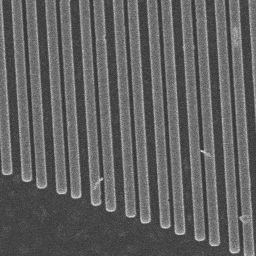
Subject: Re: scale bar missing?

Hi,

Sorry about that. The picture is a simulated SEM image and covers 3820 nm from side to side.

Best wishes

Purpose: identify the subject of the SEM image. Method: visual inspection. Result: parallel lines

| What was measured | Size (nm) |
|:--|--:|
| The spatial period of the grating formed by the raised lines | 248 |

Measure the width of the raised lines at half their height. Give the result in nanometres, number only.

145